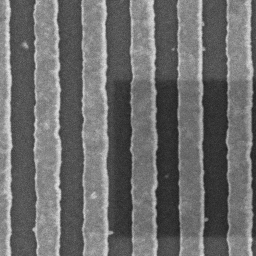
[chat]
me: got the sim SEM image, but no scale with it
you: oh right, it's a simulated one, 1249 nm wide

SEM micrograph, lines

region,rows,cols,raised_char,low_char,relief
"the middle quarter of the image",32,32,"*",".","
.....*****.......******......***
.....*****.......******......***
.....*****.......*****.......***
.....*****.......*****.......***
.....*****.......******......***
.....*****.......******......***
.....*****.......******......***
.....*****.......******......***
.....******......******......***
.....*****.......******......***
.....******......******......***
.....******......******......***
.....******......******......***
.....*****.......******......***
.....*****.......******......***
.....******......******......***
.....*****.......******......***
.....******......******......***
.....******......******......***
.....******......******......***
.....******......******......***
.....******......******......***
.....******......******......***
.....*****.......******......***
.....*****.......******......***
.....*****.......******......***
.....*****.......******......***
.....******......******......***
.....******......******......***
.....******......******......***
.....******......******......***
.....******......******......***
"